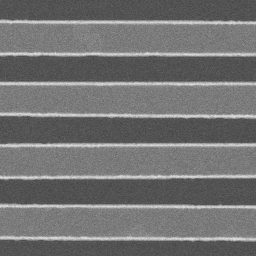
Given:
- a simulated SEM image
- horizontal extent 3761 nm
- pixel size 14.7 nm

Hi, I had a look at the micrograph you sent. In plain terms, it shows lines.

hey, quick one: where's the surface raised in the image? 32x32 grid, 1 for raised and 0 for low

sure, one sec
00000000000000000000000000000000
00000000000000000000000000000000
00000000000000000000000000000000
11111111111111111111111111111111
11111111111111111111111111111111
11111111111111111111111111111111
11111111111111111111111111111111
00000000000000000000000000000000
00000000000000000000000000000000
00000000000000000000000000000000
11111111111111111111111111111111
11111111111111111111111111111111
11111111111111111111111111111111
11111111111111111111111111111111
00000001111111111111111111111111
00000000000000000000000000000000
00000000000000000000000000000000
00000000000000000000000000000000
11111111111111111111111111111111
11111111111111111111111111111111
11111111111111111111111111111111
11111111111111111111111111111111
00000000000000000000000000000000
00000000000000000000000000000000
00000000000000000000000000000000
00000000000000000000000000000000
11111111111111111111111111111111
11111111111111111111111111111111
11111111111111111111111111111111
11111111111111111111111111111111
00000000000000000000000000000000
00000000000000000000000000000000